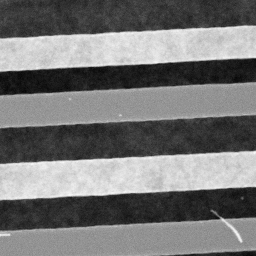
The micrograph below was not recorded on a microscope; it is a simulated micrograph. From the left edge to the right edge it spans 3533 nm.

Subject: lines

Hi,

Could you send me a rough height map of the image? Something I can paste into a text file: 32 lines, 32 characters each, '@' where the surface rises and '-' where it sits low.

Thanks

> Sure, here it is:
--------------------------------
--------------------------------
--------------------------------
--------------------------@@@@@@
-------@@@@@@@@@@@@@@@@@@@@@@@@@
@@@@@@@@@@@@@@@@@@@@@@@@@@@@@@@@
@@@@@@@@@@@@@@@@@@@@@@@@@@@@@@@@
@@@@@@@@@@@@@@@@@@@@@@@@@@@-----
@@@@@@@-------------------------
--------------------------------
------------------------------@@
--------@@@@@@@@@@@@@@@@@@@@@@@@
@@@@@@@@@@@@@@@@@@@@@@@@@@@@@@@@
@@@@@@@@@@@@@@@@@@@@@@@@@@@@@@@@
@@@@@@@@@@@@@@@@@@@@@@@@@@@-----
@@@@@@@@@-----------------------
--------------------------------
--------------------------------
--------------------------------
-------------------@@@@@@@@@@@@@
-@@@@@@@@@@@@@@@@@@@@@@@@@@@@@@@
@@@@@@@@@@@@@@@@@@@@@@@@@@@@@@@@
@@@@@@@@@@@@@@@@@@@@@@@@@@@@@@@@
@@@@@@@@@@@@@@@@@@@@@@@@@@@@----
@@@@@@@@------------------------
--------------------------------
--------------------------------
---------------------------@@@@@
---------@@@@@@@@@@@@@@@@@@@@@@@
@@@@@@@@@@@@@@@@@@@@@@@@@@@@@@@@
@@@@@@@@@@@@@@@@@@@@@@@@@@@@@@@@
@@@@@@@@@@@@@@@@@@@@@@@@@@@-----